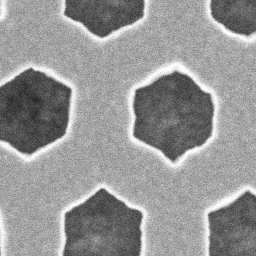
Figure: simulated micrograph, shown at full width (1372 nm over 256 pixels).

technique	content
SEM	holes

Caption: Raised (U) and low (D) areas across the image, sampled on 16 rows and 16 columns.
UUUUDDDDDUUUUDDD
UUUUUDDDUUUUUUDD
UUUUUUUUUUUUUUUU
UUUUUUUUUUUUUUUU
UDDUUUUUUUUUUUUU
DDDDUUUUUDDDDUUU
DDDDUUUUDDDDDUUU
DDDDUUUUDDDDDUUU
DDDDUUUUUDDDDUUU
UDUUUUUUUUDDUUUU
UUUUUUUUUUUUUUUU
UUUUUUUUUUUUUUUU
UUUUUDDUUUUUUUUD
UUUUDDDDDUUUUDDD
UUUUDDDDDUUUUDDD
UUUUDDDDDUUUUDDD